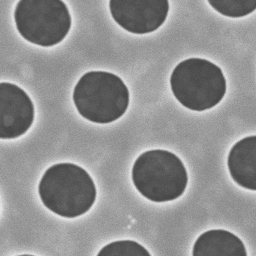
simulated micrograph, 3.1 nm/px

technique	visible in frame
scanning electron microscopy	holes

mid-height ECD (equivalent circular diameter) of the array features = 0.169 um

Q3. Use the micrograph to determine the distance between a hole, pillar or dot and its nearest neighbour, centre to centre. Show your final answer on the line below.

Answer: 296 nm